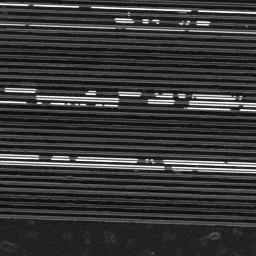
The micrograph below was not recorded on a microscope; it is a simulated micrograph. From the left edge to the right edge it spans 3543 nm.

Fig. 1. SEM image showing parallel lines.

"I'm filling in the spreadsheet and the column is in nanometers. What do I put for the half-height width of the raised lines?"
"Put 39.8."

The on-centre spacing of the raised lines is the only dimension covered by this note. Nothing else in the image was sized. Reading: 92.1 nanometers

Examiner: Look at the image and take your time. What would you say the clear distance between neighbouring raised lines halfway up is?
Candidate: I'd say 53.6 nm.